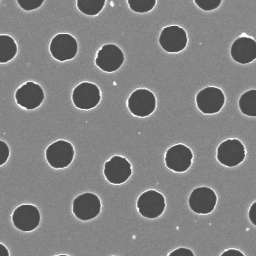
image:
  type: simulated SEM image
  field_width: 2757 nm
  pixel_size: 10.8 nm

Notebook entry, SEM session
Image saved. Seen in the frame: a regular array of holes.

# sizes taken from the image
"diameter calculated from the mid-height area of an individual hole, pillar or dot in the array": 288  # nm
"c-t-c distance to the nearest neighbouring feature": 522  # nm